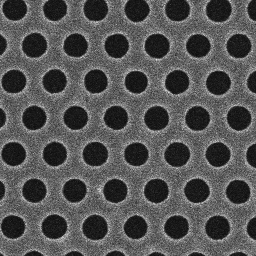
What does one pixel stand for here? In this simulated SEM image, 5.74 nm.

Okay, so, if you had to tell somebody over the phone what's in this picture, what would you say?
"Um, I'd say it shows a regular array of holes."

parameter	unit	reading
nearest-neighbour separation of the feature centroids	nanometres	233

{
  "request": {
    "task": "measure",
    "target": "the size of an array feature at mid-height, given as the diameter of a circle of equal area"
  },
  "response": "140 nanometers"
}